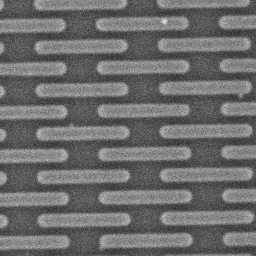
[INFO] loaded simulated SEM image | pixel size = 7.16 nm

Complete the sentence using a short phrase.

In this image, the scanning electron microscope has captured groups of lines, slits or small figures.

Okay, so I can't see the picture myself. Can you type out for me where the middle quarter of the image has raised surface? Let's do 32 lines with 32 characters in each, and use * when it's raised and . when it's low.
........***********************.
........***********************.
................................
................................
................................
****************........********
****************........********
***************.................
................................
................................
.........**********************.
*........**********************.
*........**********************.
................................
................................
.............................***
****************........********
****************........********
***************.................
................................
................................
.........**********************.
*........***********************
*........**********************.
................................
................................
.........................*******
****************........********
****************........********
******..........................
................................
................................